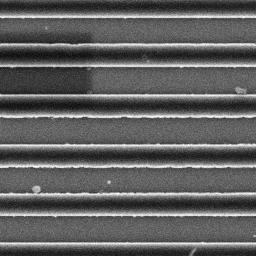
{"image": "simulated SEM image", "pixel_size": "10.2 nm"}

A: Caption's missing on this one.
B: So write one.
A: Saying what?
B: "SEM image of lines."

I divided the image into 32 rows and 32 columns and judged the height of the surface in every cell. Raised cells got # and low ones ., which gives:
################################
################################
................................
................................
................................
................................
################################
################################
................................
................................
................................
................................
################################
################################
#####.##########################
................................
................................
................................
################################
################################
################################
................................
................................
................................
################################
################################
################################
................................
................................
................................
################################
################################